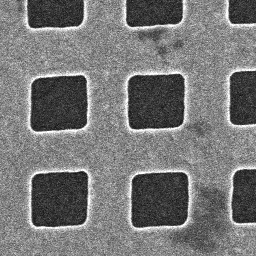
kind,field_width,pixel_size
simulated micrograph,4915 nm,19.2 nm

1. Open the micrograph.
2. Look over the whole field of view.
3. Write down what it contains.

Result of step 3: holes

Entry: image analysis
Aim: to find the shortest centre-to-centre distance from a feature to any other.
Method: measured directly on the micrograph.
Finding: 1850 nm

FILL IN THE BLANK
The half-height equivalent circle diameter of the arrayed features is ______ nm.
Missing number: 1190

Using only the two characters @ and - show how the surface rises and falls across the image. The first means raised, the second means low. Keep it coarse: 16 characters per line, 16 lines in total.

@@---@@@---@@@--
@@---@@@---@@@@-
@@@@@@@@@@@@@@@@
@@@@@@@@@@@@@@@@
@@@@@@@@@@@@@@@-
@@---@@@----@@--
@@---@@@----@@--
@@---@@@---@@@--
@@@@@@@@@@@@@@@@
@@@@@@@@@@@@@@@@
@@@@@@@@@@@@@@@@
@@----@@----@@@-
@@---@@@----@@--
@@---@@@----@@@-
@@@@@@@@@@@@@@@@
@@@@@@@@@@@@@@@@